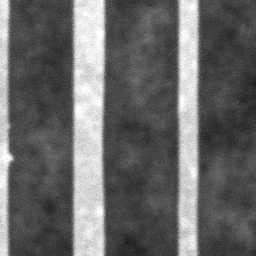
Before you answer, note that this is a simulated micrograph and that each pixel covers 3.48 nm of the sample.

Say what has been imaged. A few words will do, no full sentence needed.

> one or a few lines or trenches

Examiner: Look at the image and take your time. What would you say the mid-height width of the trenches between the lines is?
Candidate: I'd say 250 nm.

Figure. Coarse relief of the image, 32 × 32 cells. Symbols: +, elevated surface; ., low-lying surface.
+........++++..........++.......
+........++++..........++.......
+........++++..........++.......
+........++++..........++.......
+........++++..........++.......
+........++++..........++.......
+........++++..........++.......
+........++++..........++.......
+........++++..........++.......
+........++++..........++.......
+........++++..........++.......
+........++++..........++.......
+........++++..........++.......
+.........+++..........++.......
+.........+++..........++.......
+........++++..........++.......
+........++++..........++.......
+........++++..........++.......
+........++++..........++.......
+........++++..........++.......
+........++++..........+........
+........++++..........+........
+........++++..........+........
+........++++.........++........
+........++++.........++........
+........++++.........++........
+........++++.........++........
+........++++.........++........
+........++++.........++........
+........++++.........++........
+........++++.........+.........
+........++++.........++........